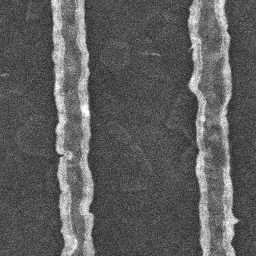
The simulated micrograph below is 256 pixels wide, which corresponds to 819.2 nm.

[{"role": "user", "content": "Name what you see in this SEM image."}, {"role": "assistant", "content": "one or a few lines or trenches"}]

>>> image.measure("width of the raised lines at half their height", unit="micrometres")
0.0882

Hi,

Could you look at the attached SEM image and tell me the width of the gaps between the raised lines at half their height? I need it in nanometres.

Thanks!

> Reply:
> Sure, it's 356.